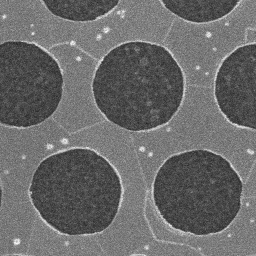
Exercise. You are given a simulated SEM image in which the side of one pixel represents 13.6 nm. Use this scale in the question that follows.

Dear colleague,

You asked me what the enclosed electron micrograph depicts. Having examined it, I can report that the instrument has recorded holes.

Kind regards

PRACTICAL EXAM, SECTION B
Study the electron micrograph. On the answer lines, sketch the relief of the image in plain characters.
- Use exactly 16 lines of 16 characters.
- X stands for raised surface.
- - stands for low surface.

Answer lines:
XXX----XXX-----X
XXXXXXXXXXXXXXXX
XXXXXXXXXXXXXXXX
---XXXX----XXX--
----XX-----XXX--
----XX------X---
----XX-----XXX--
---XXXX----XXX--
XXXXXXXXXXXXXXXX
XXXX--XXXXXX-XXX
XX-----XXX-----X
XX------XX-----X
XX------XX-----X
XXX----XXX-----X
XXXX--XXXXXX--XX
XXXXXXXXXXXXXXXX